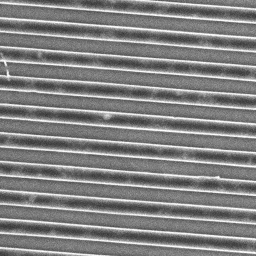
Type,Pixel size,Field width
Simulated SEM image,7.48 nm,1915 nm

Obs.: parallel lines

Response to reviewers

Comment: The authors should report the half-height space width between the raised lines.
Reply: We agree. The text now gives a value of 0.108 um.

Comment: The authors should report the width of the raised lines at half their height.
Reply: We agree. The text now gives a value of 108 nm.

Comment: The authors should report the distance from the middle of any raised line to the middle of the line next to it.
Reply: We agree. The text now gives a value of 214 nm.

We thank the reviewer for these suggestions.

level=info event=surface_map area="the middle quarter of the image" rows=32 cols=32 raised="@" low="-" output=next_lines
--@@@@@@@@@@@@@@@@@@@@@@@@@@@@@@
---------------@@@@@@@@@@@@@@@@@
----------------------------@@@@
--------------------------------
@@@@@---------------------------
@@@@@@@@@@@@@@@@@---------------
@@@@@@@@@@@@@@@@@@@@@@@@@@@@@@--
@@@@@@@@@@@@@@@@@@@@@@@@@@@@@@@@
------------@@@@@@@@@@@@@@@@@@@@
-------------------------@@@@@@@
--------------------------------
@@@@----------------------------
@@@@@@@@@@@@@@@@@---------------
@@@@@@@@@@@@@@@@@@@@@@@@@@@-@@--
@@@@@@@@@@@@@@@@@@@@@@@@@@@@@@@@
-----------@@@@@@@@@@@@@@@@@@@@@
------------------------@@@@@@@@
--------------------------------
@-------------------------------
@@@@@@@@@@@@@@------------------
@@@@@@@@@@@@@@@@@@@@@@@@@@------
@@@@@@@@@@@@@@@@@@@@@@@@@@@@@@@@
--------@@@@@@@@@@@@@@@@@@@@@@@@
---------------------@@@@@@@@@@@
--------------------------------
--------------------------------
@@@@@@@@@@@---------------------
@@@@@@@@@@@@@@@@@@@@@@@---------
@@@@@@@@@@@@@@@@@@@@@@@@@@@@@@@@
-----@@@@@@@@@@@@@@@@@@@@@@@@@@@
------------------@@@@@@@@@@@@@@
------------------------------@@